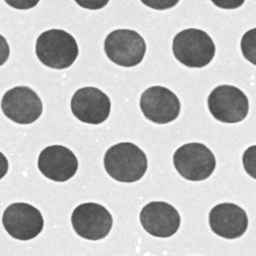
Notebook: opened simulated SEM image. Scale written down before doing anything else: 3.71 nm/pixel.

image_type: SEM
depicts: a regular array of holes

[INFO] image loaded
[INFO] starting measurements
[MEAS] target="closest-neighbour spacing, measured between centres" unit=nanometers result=246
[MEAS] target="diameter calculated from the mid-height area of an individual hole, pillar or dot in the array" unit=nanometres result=147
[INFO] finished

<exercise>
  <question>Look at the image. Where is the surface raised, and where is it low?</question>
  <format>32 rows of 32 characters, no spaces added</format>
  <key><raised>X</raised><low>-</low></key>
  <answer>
X----XXXXX---XXXXX----XXXXX---XX
XXXXXXXXXXXXXXXXXXXXXXXXXXXXXXXX
XXXXXXXXXXXXXXXXXXXXXXXXXXXXXXXX
XXXXXXXXXXXXXXXXXXXXXXXXXXXXXXXX
XXXXX----XXXX-----XXXX----XXXX--
-XXX------XXX-----XXXX-----XXX--
-XXX------XXX-----XXXX-----XXX--
-XXXX----XXXXX----XXXX----XXXXX-
XXXXXXX-XXXXXXXXXXXXXXXX-XXXXXXX
XXXXXXXXXXXXXXXXXXXXXXXXXXXXXXXX
XXXXXXXXXXXXXXXXXXXXXXXXXXXXXXXX
X---XXXXX----XXXXX----XXXX----XX
-----XXXX-----XXXX----XXXX-----X
-----XXXX-----XXXX-----XXX-----X
X----XXXX-----XXXX----XXXXX----X
XX--XXXXXXX-XXXXXXXXXXXXXXXXXXXX
XXXXXXXXXXXXXXXXXXXXXXXXXXXXXXXX
XXXXXXXXXXXXXXXXXXXXXXXXXXXXXXXX
XXXXXX--XXXXXX---XXXXX----XXXXX-
-XXXX----XXXX-----XXXX-----XXX--
-XXXX-----XXX-----XXXX-----XXX--
-XXXX----XXXX-----XXXX-----XXXX-
XXXXXXX-XXXXXX---XXXXXXX-XXXXXXX
XXXXXXXXXXXXXXXXXXXXXXXXXXXXXXXX
XXXXXXXXXXXXXXXXXXXXXXXXXXXXXXXX
XX--XXXXXX--XXXXXXX--XXXXXX--XXX
-----XXXX-----XXXX----XXXX-----X
-----XXXX-----XXXX-----XXX-----X
X----XXXX-----XXXX----XXXX-----X
X----XXXXX---XXXXXX--XXXXXXX--XX
XXXXXXXXXXXXXXXXXXXXXXXXXXXXXXXX
XXXXXXXXXXXXXXXXXXXXXXXXXXXXXXXX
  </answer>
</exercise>